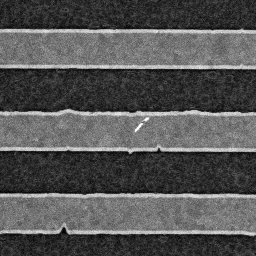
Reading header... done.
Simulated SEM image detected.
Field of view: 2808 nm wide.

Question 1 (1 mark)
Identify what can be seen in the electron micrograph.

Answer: one or a few lines or trenches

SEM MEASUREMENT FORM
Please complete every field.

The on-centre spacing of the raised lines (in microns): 0.904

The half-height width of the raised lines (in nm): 394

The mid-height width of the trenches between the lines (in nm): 505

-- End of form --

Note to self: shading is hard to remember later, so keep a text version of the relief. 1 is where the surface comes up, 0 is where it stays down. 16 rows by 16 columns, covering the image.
0000000000000000
0000000000000000
1111111111111111
1111111111111111
0000000000000000
0000000000000000
0000000000000000
1111111111111111
1111111111111111
0000000000000000
0000000000000000
0000000000000000
1111111111111111
1111111111111111
1000011111111111
0000000000000000